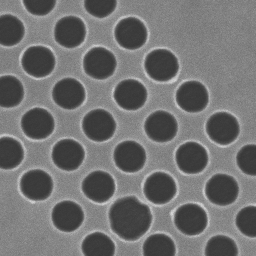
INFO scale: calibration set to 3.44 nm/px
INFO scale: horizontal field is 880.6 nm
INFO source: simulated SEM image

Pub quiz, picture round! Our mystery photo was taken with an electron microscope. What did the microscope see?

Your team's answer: a regular array of holes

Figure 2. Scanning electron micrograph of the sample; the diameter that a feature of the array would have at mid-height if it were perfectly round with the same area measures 0.102 micrometres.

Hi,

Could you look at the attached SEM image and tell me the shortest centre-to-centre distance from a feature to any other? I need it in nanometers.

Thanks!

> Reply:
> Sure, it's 148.